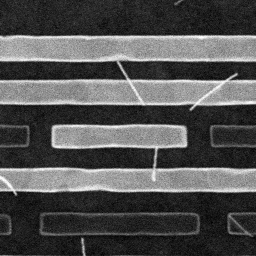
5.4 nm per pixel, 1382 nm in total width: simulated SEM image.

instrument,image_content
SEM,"wiring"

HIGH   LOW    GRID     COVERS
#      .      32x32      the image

................................
................................
................................
................................
................................
##########.##############.######
##########################.#####
......########.............#####
................................
................................
################################
################################
################################
................................
................................
................................
####...################...######
####...################...######
...................#............
................................
................................
################################
################################
################################
................................
................................
................................
#....####################....###
#....####################....###
................................
................................
................................